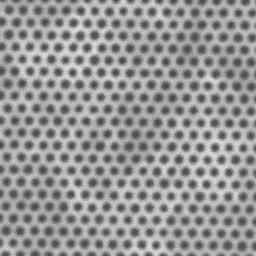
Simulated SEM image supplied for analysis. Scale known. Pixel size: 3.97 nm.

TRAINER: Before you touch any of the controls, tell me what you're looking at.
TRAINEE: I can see a regular array of holes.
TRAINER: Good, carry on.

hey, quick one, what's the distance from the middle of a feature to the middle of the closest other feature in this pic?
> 54.9 nm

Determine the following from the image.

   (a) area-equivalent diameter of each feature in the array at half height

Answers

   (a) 0.0403 micrometres